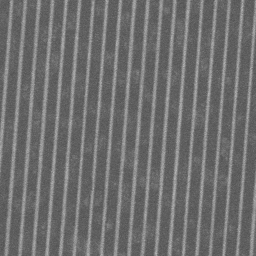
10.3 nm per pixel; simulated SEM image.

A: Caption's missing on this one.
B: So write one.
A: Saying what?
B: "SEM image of parallel lines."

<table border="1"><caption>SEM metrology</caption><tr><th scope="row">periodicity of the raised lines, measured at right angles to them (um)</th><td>0.14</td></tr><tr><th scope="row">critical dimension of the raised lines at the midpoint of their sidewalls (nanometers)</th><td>25.7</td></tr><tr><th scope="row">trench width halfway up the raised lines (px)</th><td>11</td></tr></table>